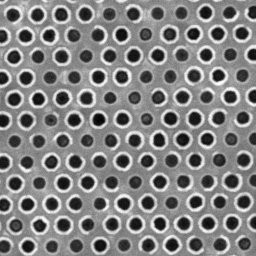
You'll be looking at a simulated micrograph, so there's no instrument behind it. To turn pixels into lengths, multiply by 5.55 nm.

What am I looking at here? a regular array of holes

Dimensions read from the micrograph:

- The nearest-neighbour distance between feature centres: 132 nm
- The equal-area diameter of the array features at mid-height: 71.9 nm